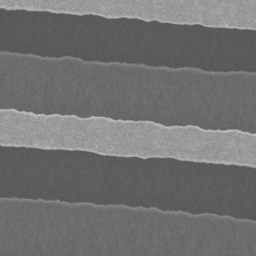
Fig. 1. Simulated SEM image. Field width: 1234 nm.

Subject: lines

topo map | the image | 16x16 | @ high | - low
@@@@@@@@@@@@@@@@
-----------@@@@@
----------------
@@--------------
@@@@@@@@@@@@@---
@@@@@@@@@@@@@@@@
@@@@@@@@@@@@@@@@
@@@@@@@@@@@@@@@@
@@@@@@@@@@@@@@@@
------@@@@@@@@@@
----------------
----------------
@@--------------
@@@@@@@@@@@@@@--
@@@@@@@@@@@@@@@@
@@@@@@@@@@@@@@@@